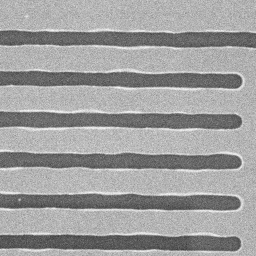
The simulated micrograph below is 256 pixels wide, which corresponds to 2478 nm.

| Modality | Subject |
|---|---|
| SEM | groups of lines, slits or small figures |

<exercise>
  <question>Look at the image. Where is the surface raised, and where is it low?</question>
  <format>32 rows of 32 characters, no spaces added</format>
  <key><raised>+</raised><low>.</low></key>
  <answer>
++++++++++++++++++++++++++++++++
++++++++++++++++++++++++++++++++
++++++++++++++++++++++++++++++++
++++++++++++++++++++++++++++++++
................................
................................
++++++++++++++++++++++++++++++++
++++++++++++++++++++++++++++++++
++++++++++++++++++++++++++++++++
..............................++
..............................++
++++++++++++++++++++++++++++++++
++++++++++++++++++++++++++++++++
++++++++++++++++++++++++++++++++
..............................++
..............................++
++++++++++++++++++++++++++++++++
++++++++++++++++++++++++++++++++
++++++++++++++++++++++++++++++++
..............................++
..............................++
++++++++++++++++++++++++++++++++
++++++++++++++++++++++++++++++++
++++++++++++++++++++++++++++++++
.............................+++
..............................++
++++++++++++++++++++++++++++++++
++++++++++++++++++++++++++++++++
++++++++++++++++++++++++++++++++
.....................+.....+++++
..............................++
++++++++++++++++++++++++++...+++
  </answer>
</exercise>